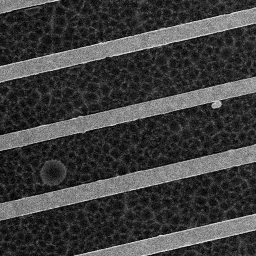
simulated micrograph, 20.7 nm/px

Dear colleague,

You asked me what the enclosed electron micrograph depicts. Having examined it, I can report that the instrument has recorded one or a few lines or trenches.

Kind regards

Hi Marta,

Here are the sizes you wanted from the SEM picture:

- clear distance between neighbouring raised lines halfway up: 1.06 µm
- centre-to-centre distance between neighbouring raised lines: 1.38 µm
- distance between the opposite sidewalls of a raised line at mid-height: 313 nanometers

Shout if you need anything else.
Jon